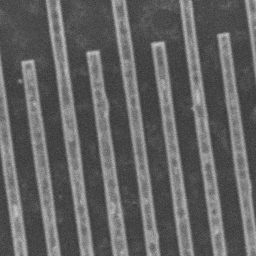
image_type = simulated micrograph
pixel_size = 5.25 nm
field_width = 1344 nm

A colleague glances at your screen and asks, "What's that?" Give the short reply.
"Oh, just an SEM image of parallel lines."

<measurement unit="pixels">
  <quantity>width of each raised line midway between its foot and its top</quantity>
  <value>10.9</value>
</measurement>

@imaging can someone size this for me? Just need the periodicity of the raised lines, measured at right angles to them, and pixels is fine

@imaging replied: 32.9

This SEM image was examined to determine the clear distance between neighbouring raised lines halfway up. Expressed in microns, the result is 0.114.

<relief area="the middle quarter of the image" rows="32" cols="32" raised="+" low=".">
+.....+++......++......+++.....+
+......++......+++.....+++.....+
+......++......+++.....+++......
+......++......+++.....+++......
+......+++.....+++......++......
+......+++.....+++......++......
++.....+++.....+++......++......
++.....+++......++......++......
++......++......++......+++.....
++......+++.....++......+++.....
++......+++.....+++.....+++.....
++......+++.....+++......++.....
++......+++......++......++.....
+++.....+++......++......++.....
+++.....+++......++......++.....
+++.....+++......++......++.....
+++......++......++......+++....
+++......++......+++.....+++....
+++......++......+++......++....
.++......+++.....+++......++....
.+++.....+++......++......++....
.+++.....+++......++......++....
.+++.....+++......++......++....
.+++.....+++......++......+++...
.+++.....+++......++......+++...
.+++......++......+++.....+++...
..++......+++.....+++......++...
..+++.....+++......++......++...
..++......+++......++......++...
..+++.....+++......++......+++..
..+++.....+++......++......+++..
..+++.....++++.....++......+++..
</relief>